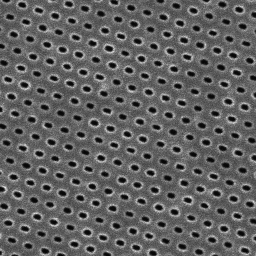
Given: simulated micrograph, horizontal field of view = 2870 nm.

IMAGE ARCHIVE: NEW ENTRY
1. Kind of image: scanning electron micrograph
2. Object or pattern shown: a regular array of holes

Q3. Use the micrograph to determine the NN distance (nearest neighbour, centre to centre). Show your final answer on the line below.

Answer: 190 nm